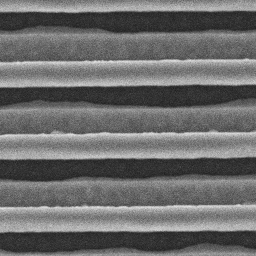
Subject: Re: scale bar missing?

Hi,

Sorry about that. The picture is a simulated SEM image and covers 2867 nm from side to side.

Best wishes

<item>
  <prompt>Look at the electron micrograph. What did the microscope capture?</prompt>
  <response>lines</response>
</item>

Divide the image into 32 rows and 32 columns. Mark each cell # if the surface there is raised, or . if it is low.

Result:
################################
......####......................
................................
................................
################################
################################
################################
################################
################################
################################
################################
................................
................................
............................####
################################
################################
################################
################################
################################
################################
................................
................................
...............................#
################################
################################
################################
################################
################################
################################
................................
................................
........................#######.